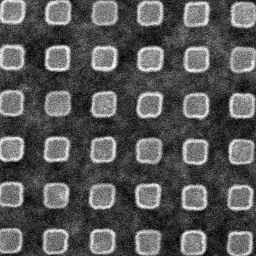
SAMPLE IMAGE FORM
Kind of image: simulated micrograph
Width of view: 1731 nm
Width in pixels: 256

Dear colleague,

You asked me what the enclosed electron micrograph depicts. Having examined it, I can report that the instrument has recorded a regular array of raised bodies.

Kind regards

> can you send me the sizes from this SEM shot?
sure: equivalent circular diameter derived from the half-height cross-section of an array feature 180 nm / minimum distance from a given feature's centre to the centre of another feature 309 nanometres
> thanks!